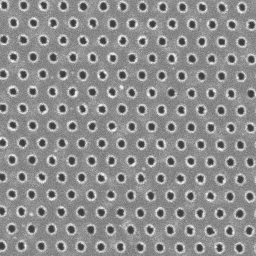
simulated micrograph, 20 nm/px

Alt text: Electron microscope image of a regular array of holes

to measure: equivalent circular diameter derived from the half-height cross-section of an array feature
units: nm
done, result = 158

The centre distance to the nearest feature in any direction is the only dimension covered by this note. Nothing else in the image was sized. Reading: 0.391 microns